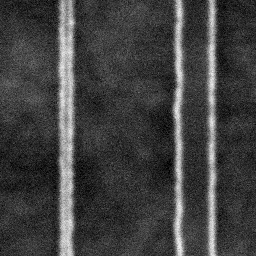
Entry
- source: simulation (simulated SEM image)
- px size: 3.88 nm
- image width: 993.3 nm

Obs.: lines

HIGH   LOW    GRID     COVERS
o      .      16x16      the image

...........oo...
....o......oo...
...........oo...
...........oo...
...........oo...
...........oo...
...........oo...
...........oo...
...........oo...
...........oo...
...........oo...
...........oo...
...........oo...
...........oo...
...........oo...
...........oo...